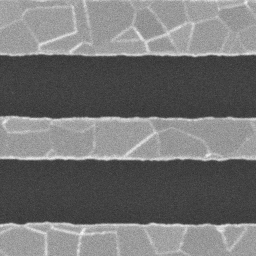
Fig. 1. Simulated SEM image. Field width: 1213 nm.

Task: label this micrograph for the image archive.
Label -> lines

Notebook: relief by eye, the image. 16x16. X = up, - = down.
XXXXXXXXXXXXXXXX
XXXXXXXXXXXXXXXX
XXXXXXXXXXXXXXXX
------------X---
----------------
----------------
----------------
XXXXXXXXXXXXXXXX
XXXXXXXXXXXXXXXX
XXXXXXXXXXXXXXXX
----------------
----------------
----------------
----------------
XXXXXXXXXXXXXXXX
XXXXXXXXXXXXXXXX